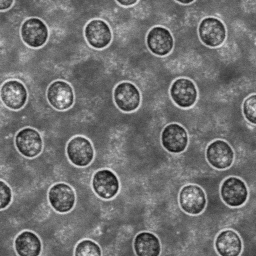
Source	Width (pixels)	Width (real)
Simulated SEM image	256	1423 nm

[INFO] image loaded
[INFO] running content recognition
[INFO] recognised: a regular array of holes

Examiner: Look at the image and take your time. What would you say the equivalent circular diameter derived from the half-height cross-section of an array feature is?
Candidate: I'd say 0.161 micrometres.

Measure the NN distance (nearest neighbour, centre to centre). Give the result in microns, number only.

0.258